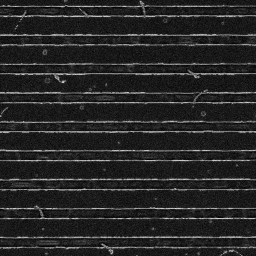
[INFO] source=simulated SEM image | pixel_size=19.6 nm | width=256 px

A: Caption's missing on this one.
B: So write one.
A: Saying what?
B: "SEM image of parallel lines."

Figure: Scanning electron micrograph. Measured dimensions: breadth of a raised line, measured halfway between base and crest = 379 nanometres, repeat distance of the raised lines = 565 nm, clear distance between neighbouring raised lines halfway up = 181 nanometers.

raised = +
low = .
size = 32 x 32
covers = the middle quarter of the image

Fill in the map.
................................
................................
......+++...............++++++++
++++++++++++++++++++++++++++++++
++++++++++++++++++++++++++++++++
++++++++++++++++++++++++++++++++
++++++++++++++++++++++++++++++++
................................
.........+++....................
................................
++++++++++++++++++++++++++++++++
++++++++++++++++++++++++++++++++
++++++++++++++++++++++++++++++++
++++++++++++++++++++++++++++++++
++++++++++++++++++++............
................................
................................
++++++++++++++++++++++++++++++++
++++++++++++++++++++++++++++++++
++++++++++++++++++++++++++++++++
++++++++++++++++++++++++++++++++
++++++++++++++++++++++++++++++++
................................
................................
++++++++++++++++++++++++++++++++
++++++++++++++++++++++++++++++++
++++++++++++++++++++++++++++++++
++++++++++++++++++++++++++++++++
++++++++++++++++++++++++++++++++
................................
................................
++++++++++++++++++++++++++++++++